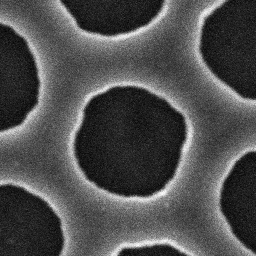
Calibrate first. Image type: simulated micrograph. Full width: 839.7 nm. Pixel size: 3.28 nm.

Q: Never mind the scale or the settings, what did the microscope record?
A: holes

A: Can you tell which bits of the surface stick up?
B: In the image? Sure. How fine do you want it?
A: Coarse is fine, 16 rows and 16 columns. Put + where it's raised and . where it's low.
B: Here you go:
++++......++++..
+++++....++++...
..++++++++++....
..+++++++++++...
..+++++++++++...
..+++++..+++++..
..+++......+++++
..+++.......++++
+++++.......++++
+++++......+++++
+++++......+++..
++++++.....+++..
...+++++++++++..
....++++++++++..
....+++++++++++.
....++++...++++.